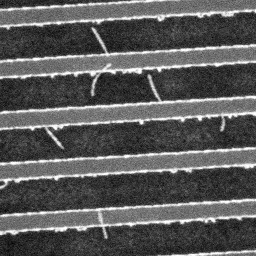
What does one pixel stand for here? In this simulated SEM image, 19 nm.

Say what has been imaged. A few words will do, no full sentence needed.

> lines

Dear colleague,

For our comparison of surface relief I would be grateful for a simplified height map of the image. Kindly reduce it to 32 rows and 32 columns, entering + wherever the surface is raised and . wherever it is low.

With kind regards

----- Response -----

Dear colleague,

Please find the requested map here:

...........+++++++++++++++++++++
++++++++++++++++++++++++++++++..
+++++++++++++...................
................................
................................
................................
..................++++++++++++++
..++++++++++++++++++++++++++++++
++++++++++++++++++++............
++++............................
................................
................................
..........................++++++
.........+++++++++++++++++++++++
++++++++++++++++++++++++++.+....
++++++++++......................
................................
................................
................................
...............+++++++++++++++++
++++++++++++++++++++++++++++++++
+++++++++++++++++...............
+...............................
................................
................................
........................++++++++
.......+++++++++++++++++++++++++
++++++++++++++++++++++++.+......
+++++++++.......................
................................
................................
..............................++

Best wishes